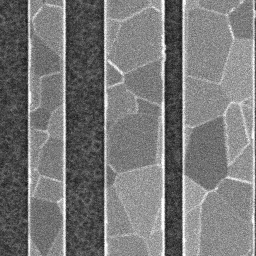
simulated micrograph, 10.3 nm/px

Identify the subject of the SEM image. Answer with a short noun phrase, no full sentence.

one or a few lines or trenches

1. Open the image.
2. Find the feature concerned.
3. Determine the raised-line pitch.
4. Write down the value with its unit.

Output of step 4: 888 nm